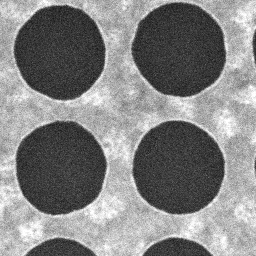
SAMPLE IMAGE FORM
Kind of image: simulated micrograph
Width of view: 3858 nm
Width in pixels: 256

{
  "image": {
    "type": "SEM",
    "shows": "holes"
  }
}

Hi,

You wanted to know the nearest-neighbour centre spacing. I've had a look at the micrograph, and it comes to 1750 nm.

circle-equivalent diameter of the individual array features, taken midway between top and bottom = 1420 nanometers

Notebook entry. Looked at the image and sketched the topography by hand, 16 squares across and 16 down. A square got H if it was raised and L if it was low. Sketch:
HHHLLHHHHHLLLHHH
HHLLLLHHHLLLLLHH
HLLLLLHHLLLLLLHH
HLLLLLLHLLLLLLHH
HLLLLLHHHLLLLLHH
HHLLLLHHHHLLLHHH
HHHHHHHHHHHHHHHH
HHHHHHHHHHHHHHHH
HHLLLLHHHLLLLHHH
HLLLLLLHLLLLLLHH
HLLLLLLHLLLLLLHH
HLLLLLHHLLLLLLHH
HHLLLLHHHLLLLHHH
HHHHHHHHHHHHHHHH
HHHHHHHHHHHHHHHH
HHLLLLHHHLLLLHHH